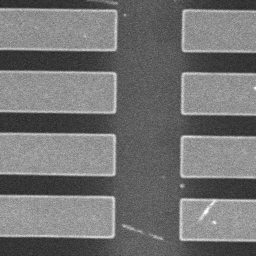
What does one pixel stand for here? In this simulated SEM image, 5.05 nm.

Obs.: groups of lines, slits or small figures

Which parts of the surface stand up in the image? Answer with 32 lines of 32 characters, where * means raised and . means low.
................................
**************.........*********
***************........*********
**************.........*********
**************.........*********
**************.........*********
..............................**
................................
................................
**************.........*********
**************.........*********
**************.........*********
**************.........*********
**************.........*********
................................
................................
................................
**************.........*********
**************.........*********
**************.........*********
**************.........*********
**************.........*********
................................
................................
**..............................
**************.........*********
**************.........*********
**************.........*********
**************.........*********
**************.........*********
................................
................................